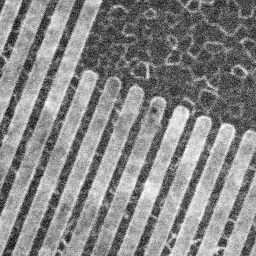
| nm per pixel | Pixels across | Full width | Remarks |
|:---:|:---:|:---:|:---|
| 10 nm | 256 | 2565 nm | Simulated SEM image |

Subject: parallel lines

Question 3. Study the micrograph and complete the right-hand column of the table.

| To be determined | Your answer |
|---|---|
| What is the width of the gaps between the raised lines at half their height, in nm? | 103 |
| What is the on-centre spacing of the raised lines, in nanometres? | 246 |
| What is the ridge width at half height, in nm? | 143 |